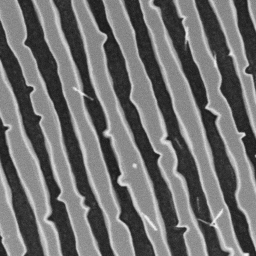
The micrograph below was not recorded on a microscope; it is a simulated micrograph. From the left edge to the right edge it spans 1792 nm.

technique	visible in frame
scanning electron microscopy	parallel lines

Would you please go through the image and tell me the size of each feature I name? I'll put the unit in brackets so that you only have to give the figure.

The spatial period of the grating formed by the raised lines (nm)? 237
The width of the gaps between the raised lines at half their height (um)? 0.109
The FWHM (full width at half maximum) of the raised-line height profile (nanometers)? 127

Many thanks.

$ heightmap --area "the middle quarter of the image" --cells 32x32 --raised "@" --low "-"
@@@---@@@@@----@@@@@----@@@@@---
@@@---@@@@@-----@@@@-----@@@@---
@@@---@@@@@-----@@@@@----@@@@@--
@@@@---@@@@-----@@@@@----@@@@@--
@@@@---@@@@@-----@@@@@---@@@@@@-
@@@@---@@@@@-----@@@@@----@@@@@-
@@@@----@@@@-----@@@@@----@@@@@@
@@@@@---@@@@@----@@@@@@----@@@@@
@@@@@---@@@@@---@@@@@@@----@@@@@
-@@@@----@@@@----@@@@@@----@@@@@
-@@@@----@@@@@----@@@@@----@@@@@
-@@@@@----@@@@----@@@@@@---@@@@@
--@@@@----@@@@-----@@@@@----@@@@
--@@@@-----@@@@----@@@@@@---@@@@
--@@@@@----@@@@----@@@@@@----@@@
---@@@@----@@@@@----@@@@@----@@@
---@@@@@---@@@@@----@@@@@-----@@
---@@@@@--@@@@@@@----@@@@@----@@
----@@@@@---@@@@@----@@@@-----@@
----@@@@@---@@@@@----@@@@@-----@
----@@@@@---@@@@@@----@@@@@----@
----@@@@@----@@@@@----@@@@@@----
-----@@@@----@@@@@@-----@@@@----
@----@@@@@---@@@@@@-----@@@@----
@----@@@@@----@@@@@@---@@@@@----
@----@@@@@----@@@@@@----@@@@----
@@---@@@@@@---@@@@@@----@@@@----
@@----@@@@@---@@@@@@@----@@@----
@@----@@@@@@-@@@@@@@@----@@@@@--
@@-----@@@@@-@@@@@@@@-----@@@@--
@@@----@@@@@--@@@@@@@@----@@@@--
@@@----@@@@@----@@@@@@-----@@@@-